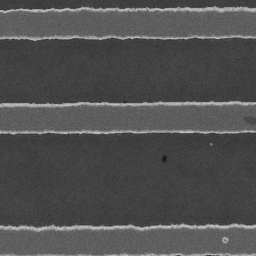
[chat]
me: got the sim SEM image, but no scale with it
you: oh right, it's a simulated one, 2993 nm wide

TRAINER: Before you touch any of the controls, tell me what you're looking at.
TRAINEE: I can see lines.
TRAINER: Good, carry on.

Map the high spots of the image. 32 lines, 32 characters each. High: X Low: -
--------------------------------
XXXXXXXXXXXXXXXXXXXXXXXXXXXXXXXX
XXXXXXXXXXXXXXXXXXXXXXXXXXXXXXXX
XXXXXXXXXXXXXXXXXXXXXXXXXXXXXXXX
XXXXXXXXXXXXXXXXXXXXXXXXXXXXXXXX
--------------------------------
--------------------------------
--------------------------------
--------------------------------
--------------------------------
--------------------------------
--------------------------------
--------------------------------
XXXXXXXXXXXXXXXXXXXXXXXXXXXXXXXX
XXXXXXXXXXXXXXXXXXXXXXXXXXXXXXXX
XXXXXXXXXXXXXXXXXXXXXXXXXXXXXXXX
XXXXXXXXXXXXXXX-XX-------X-XXX--
--------------------------------
--------------------------------
--------------------------------
--------------------------------
--------------------------------
--------------------------------
--------------------------------
--------------------------------
--------------------------------
--------------------------------
--------------------------------
XXXX-XX-XXXXXXXXX-XXXXXXXXXXXXXX
XXXXXXXXXXXXXXXXXXXXXXXXXXXXXXXX
XXXXXXXXXXXXXXXXXXXXXXXXXXXXXXXX
XXXXXXXXXXXXXXXXXXXXXXXXXXXXXXXX